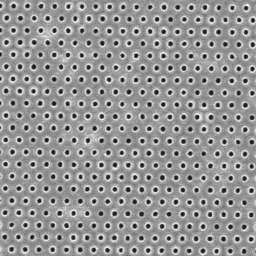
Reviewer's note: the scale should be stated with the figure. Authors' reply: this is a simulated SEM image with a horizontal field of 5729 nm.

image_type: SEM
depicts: a regular array of holes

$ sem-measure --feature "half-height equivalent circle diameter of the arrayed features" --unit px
5.04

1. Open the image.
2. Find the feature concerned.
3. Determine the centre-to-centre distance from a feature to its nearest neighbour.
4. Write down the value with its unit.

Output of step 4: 296 nm